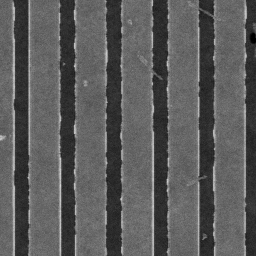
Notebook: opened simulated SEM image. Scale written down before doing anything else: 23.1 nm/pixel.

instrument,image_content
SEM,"lines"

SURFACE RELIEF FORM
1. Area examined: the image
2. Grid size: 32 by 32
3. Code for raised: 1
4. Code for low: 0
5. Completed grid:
11001110011110011110011110011110
11001110011110011110011110011110
11001110011110011110011110011110
11001110001110011110011110011110
11001110011110011110011110011110
11001110011110011110011110011110
11001110011110011110011110011110
11001110011110011110011110011110
11001110011110011110011110011110
11001110001110011110011110011110
11001110011110011110011110011110
11001110011110011110011110011110
11001110011110011110011110011110
11001110011110011110011110011110
11001110001110011110011110011110
11001110011110011110011110011110
11001110011110011110011110011110
11001110011110011110011110011110
11001110001110011110011110011110
11001110011110011110011110011110
11001110011110011110011110011110
11001110011110011110011110011110
11001110011110011110011110011110
11001110011110011110011110011110
11001110011110011110011110011110
11001110001110011110011110011110
11001110001110011110011110011110
11001110011110011110011110011110
11001110011110011110011110011110
11001110001110011110011110011110
11001110001110011110011110011110
11001110001110011110011110011110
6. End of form